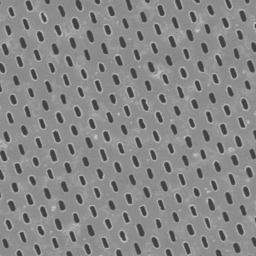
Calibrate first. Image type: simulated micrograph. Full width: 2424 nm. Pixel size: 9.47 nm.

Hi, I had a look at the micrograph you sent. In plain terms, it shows a regular array of holes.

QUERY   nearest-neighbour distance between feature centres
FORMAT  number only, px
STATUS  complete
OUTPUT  18.6